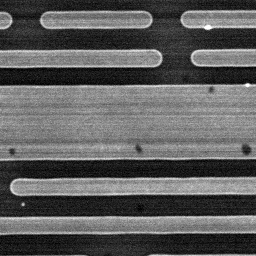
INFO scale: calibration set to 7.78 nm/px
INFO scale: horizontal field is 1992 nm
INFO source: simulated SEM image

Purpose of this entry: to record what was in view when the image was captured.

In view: groups of lines, slits or small figures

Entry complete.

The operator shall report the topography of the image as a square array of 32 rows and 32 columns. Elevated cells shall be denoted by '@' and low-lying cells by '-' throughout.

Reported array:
--------------------------------
------@@@@@@@@@@@@-----@@@@@@@@@
@----@@@@@@@@@@@@@@----@@@@@@@@@
@-----@------------------@@-----
--------------------------------
--------------------------------
@@@@@@@@@@@@@@@@@@@@----@@@@@@@@
@@@@@@@@@@@@@@@@@@@@----@@@@@@@@
--------------------------------
--------------------------------
--------------------------------
@@@@@@@@@@@@@@@@@@@@@@@@@@@@@@@@
@@@@@@@@@@@@@@@@@@@@@@@@@@@@@@@@
@@@@@@@@@@@@@@@@@@@@@@@@@@@@@@@@
@@@@@@@@@@@@@@@@@@@@@@@@@@@@@@@@
@@@@@@@@@@@@@@@@@@@@@@@@@@@@@@@@
@@@@@@@@@@@@@@@@@@@@@@@@@@@@@@@@
@@@@@@@@@@@@@@@@@@@@@@@@@@@@@@@@
@@@@@@@@@@@@@@@@@@@@@@@@@@@@@@@@
@@@@@@@@@@@@@@@@@@@@@@@@@@@@@@@@
--------------------------------
--------------------------------
--@@@-@@@@@@@@@@@@@@@@@@@@@@@@@@
-@@@@@@@@@@@@@@@@@@@@@@@@@@@@@@@
--------------------------------
--------------------------------
--------------------------------
@@@@@@@@@@@@@@@@@@@@@@@@@@@@@@@@
@@@@@@@@@@@@@@@@@@@@@@@@@@@@@@@@
--------------------------------
--------------------------------
--------------------------------